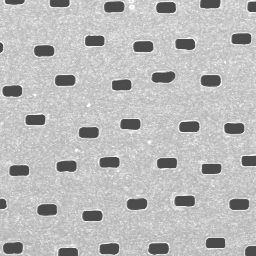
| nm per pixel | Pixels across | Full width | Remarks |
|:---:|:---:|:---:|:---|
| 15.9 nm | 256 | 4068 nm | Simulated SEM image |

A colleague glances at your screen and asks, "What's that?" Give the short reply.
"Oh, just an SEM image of a regular array of holes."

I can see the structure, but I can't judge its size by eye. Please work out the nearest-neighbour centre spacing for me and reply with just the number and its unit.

40.8 px